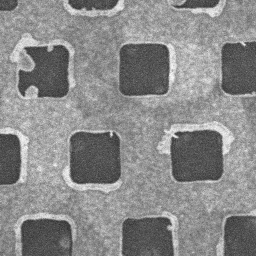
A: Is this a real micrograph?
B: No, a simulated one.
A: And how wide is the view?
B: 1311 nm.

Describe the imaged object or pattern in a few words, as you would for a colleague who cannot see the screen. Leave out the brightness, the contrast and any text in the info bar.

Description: holes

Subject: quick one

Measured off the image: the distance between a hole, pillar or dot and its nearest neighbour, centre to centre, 0.513 microns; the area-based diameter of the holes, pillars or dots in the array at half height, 0.295 micrometres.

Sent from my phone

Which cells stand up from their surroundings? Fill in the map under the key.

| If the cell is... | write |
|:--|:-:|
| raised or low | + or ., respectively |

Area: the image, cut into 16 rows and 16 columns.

.++++..++++..+++
++++++++++++++++
++++++++++++++++
+...+++....+++..
+...+++....+++..
+...+++....+++..
++++++++++++++++
++++++++++++++++
.++++..++++...++
.+++....+++...++
.+++....+++...++
.+++++.+++++++++
++++++++++++++++
+++++++++++++++.
+...++++...+++..
+....+++...+++..